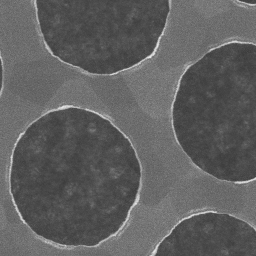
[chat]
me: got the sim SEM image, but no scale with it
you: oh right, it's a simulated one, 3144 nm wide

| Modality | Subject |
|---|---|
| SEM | holes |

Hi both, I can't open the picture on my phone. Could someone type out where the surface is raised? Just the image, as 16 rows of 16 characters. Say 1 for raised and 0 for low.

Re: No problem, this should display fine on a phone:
1100000000011111
1100000000111111
1110000000111111
1111000001111000
1111110111110000
1111111111100000
1111111111100000
1100000111100000
1000000011100000
1000000011110000
1000000001111000
1000000001111111
1000000011111111
1000000011110001
1100000111100000
1111111111000000